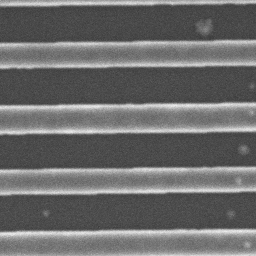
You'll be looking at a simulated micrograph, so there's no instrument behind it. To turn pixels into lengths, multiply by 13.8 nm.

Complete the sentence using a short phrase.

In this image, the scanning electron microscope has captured lines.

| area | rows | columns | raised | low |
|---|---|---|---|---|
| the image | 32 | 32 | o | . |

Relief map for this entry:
ooooooooooooooo.................
................................
................................
................................
................................
oooooooooooooooooooooooooooooooo
oooooooooooooooooooooooooooooooo
oooooooooooooooooooooooooooooooo
................................
................................
................................
................................
................................
oooooooooooooooooooooooooooooooo
oooooooooooooooooooooooooooooooo
oooooooooooooooooooooooooooooooo
ooooooooooooooooooooooo.........
................................
................................
................................
................................
oooooooooooooooooooooooooooooooo
oooooooooooooooooooooooooooooooo
oooooooooooooooooooooooooooooooo
................................
................................
................................
................................
................................
oooooooooooooooooooooooooooooooo
oooooooooooooooooooooooooooooooo
oooooooooooooooooooooooooooooooo